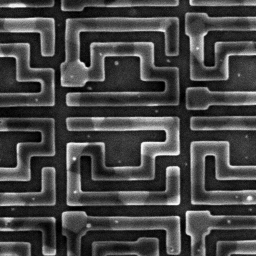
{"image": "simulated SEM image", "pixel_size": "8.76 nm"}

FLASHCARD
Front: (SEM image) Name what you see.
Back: wiring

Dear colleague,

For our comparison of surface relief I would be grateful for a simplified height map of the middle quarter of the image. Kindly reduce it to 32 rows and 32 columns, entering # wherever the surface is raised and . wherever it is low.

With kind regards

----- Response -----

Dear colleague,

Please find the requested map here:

#####..###.........####.........
##########.........##########...
##########.........##########...
##########.........##########...
#####....................####...
#####....................####...
.........................####.##
.############################.##
.############################.##
.############################.##
..............................##
................................
................................
.................###....#####...
.############################...
.############################...
.###############.........####...
..........................###...
..........................###...
.........................####...
.#########.........##########...
.#########.........##########...
.#########.........##########...
.###...###.........####.........
.###...###.........####.........
.###...###.........####.........
.###...################...###...
.###...################...###...
.###...################...###...
.###......................###...
.###......................###...
.###.....................####...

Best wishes